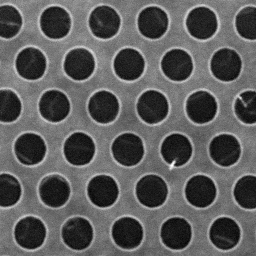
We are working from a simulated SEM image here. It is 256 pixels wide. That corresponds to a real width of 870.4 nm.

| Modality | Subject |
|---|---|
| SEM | a regular array of holes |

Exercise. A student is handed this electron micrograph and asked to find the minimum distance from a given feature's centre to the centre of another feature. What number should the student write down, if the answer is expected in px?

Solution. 48.2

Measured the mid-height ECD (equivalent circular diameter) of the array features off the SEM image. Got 0.114 microns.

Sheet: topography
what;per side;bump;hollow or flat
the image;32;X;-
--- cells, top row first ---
XXXXXXXXXXXXXXXXXXXXXXXXXXXXXXXX
--XXX---XXX----XXX---XXX---XXX--
---XX----XX----XX----XX----XX---
---XX----XX----XX----XX----XX---
--XXXX--XXXX--XXXX--XXXX---XXX--
XXXXXXXXXXXXXXXXXXXXXXXXXXXXXXXX
XX---XXX---XXXX--XXXX--XXXX---XX
XX----XX----XX----XX----XX----XX
XX----XX----XX----XX----XX----XX
XXX--XXX---XXXX---XXX---XXX---XX
XXXXXXXXXXXXXXXXXXXXXXXXXXXXXXXX
--XXXX--XXXX--XXXX--XXXX--XXXX--
---XX----XX----XX----XX----XX---
---XX----XX----XX----XX----XX---
--XXX---XXX----XX----XX----XXX--
XXXXXXXXXXXXXXXXXX--XXXXXXXXXXX-
XXXXXXXXX-XXXXXXXXXXXXXXXXXXXXXX
XX----XX----XX----XX----XX----XX
XX----XX----XX----XX----XX----XX
XX----XX----XX----XX----XX----XX
XXX--XXXX--XXXX--XXXX--XXXX--XXX
XXXXXXXXXXXXXXXXXXXXXXXXXXXXXXXX
--XXX---XXX---XXX---XXXX---XXX--
---XX----XX----XX----XX----XX---
---XX----XX----XX----XX----XX---
--XXXX--XXXX--XXXX--XXXX--XXXX--
XXXXXXXXXXXXXXXXXXXXXXXXXXXXXXXX
XX---XXX---XXXX--XXXX--XXXX--XXX
XX----XX----XX----XX----XX----XX
XX----XX----XX----XX----XX----XX
XX---XXX---XXX----XX----XXX---XX
XXXXXXXXXXXXXXXXXXXXXXXXXXXXXXXX